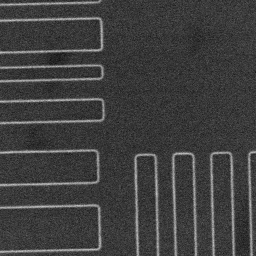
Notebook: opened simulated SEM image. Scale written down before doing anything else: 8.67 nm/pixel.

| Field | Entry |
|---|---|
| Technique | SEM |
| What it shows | groups of lines, slits or small figures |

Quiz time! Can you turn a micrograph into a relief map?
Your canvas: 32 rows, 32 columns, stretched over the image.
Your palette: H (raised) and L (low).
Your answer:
LLLLHHHHHHHHHHHHHHHHHHHHHHHHHHHH
HHHHHHHHHHHHHHHHHHHHHHHHHHHHHHHH
HHHHLLLLLLLLHHHHHHHHHHHHHHHHHHHH
LLLLLLLLLLLLLHHHHHHHHHHHHHHHHHHH
LLLLLLLLLLLLLHHHHHHHHHHHHHHHHHHH
LLLLLLLLLLLLLHHHHHHHHHHHHHHHHHHH
LLLHHHHHHHHHHHHHHHHHHHHHHHHHHHHH
HHHHHHHHHHHHHHHHHHHHHHHHHHHHHHHH
LLLLLLLLLLLLLHHHHHHHHHHHHHHHHHHH
LLLLLLLLLLLLLHHHHHHHHHHHHHHHHHHH
HHHHHHHHHHHHHHHHHHHHHHHHHHHHHHHH
HHHHHHHHHHHHHHHHHHHHHHHHHHHHHHHH
HHHHHHHHHLLLHHHHHHHHHHHHHHHHHHHH
LLLLLLLLLLLLLHHHHHHHHHHHHHHHHHHH
LLLLLLLLLLLLLHHHHHHHHHHHHHHHHHHH
HHHHHHHHHHHHHHHHHHHHHHHHHHHHHHHH
HHHHHHHHHHHHHHHHHHHHHHHHHHHHHHHH
HHHHHHHHHHHHHHHHHHHHHHHHHHHHHHHH
HHHHHHHHHHHHHHHHHHHHHHHHHHHHHHHH
LLLLLLLLLLLLHHHHHLLHHHLLHHHLLHHL
LLLLLLLLLLLLHHHHHLLHHHLLHHLLLHHL
LLLLLLLLLLLLHHHHHLLHHHLLHHLLLHHL
LLLLLLLLLLLLHHHHHLLLHHLLHHLLLHHL
HHHHHHHHHHHHHHHHHLLLHHLLHHLLLHHL
HHHHHHHHHHHHHHHHHLLLHHLLHHHLLHHL
HHHHHHHHHHHHHHHHHLLLHHLLHHHLLHHL
LLLLLLLLLLLLHHHHHLLLHHLLHHHLLHHL
LLLLLLLLLLLLHHHHHLLLHHLLHHHLLHHL
LLLLLLLLLLLLHHHHHLLLHHLLHHHLLHHL
LLLLLLLLLLLLHHHHHLLLHHLLHHHLLHHL
LLLLLLLLLLLLLHHHHLLLHHLLHHHLLHHL
HHHHHHHHHHHHHHHHHLLLHHLLHHHLLHHL